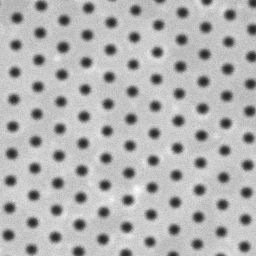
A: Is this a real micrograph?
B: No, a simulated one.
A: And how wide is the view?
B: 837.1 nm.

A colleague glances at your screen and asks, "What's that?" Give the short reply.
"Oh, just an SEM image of a regular array of holes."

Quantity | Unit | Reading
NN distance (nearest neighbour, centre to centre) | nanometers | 88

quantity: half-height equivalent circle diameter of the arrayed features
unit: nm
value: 37.8